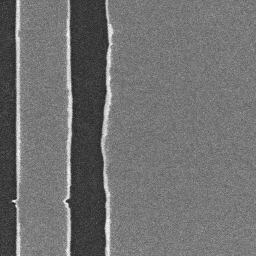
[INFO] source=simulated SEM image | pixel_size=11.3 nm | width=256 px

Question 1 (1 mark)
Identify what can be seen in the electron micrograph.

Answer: one or a few lines or trenches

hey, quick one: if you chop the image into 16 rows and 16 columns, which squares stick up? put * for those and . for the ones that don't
.***...*********
.***...*********
.***...*********
.***...*********
.***...*********
.***...*********
.***...*********
.***...*********
.***..**********
.***..**********
.***...*********
.***...*********
.***...*********
.***...*********
.***...*********
.***...*********